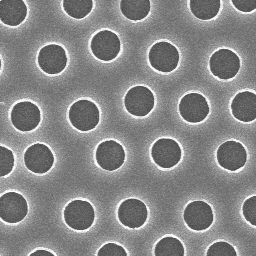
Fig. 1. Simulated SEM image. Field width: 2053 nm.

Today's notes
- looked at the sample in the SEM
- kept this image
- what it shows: a regular array of holes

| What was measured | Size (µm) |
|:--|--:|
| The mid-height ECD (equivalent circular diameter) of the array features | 0.243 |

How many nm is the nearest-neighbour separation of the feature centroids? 426